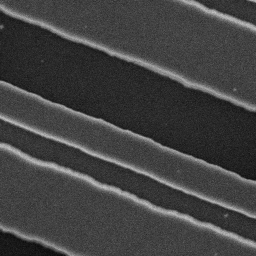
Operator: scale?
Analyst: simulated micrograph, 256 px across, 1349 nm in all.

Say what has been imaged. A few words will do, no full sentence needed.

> lines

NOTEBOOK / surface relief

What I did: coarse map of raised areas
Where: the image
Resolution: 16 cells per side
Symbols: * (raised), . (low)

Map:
****************
..**************
.....***********
.......*********
..........******
*............***
****...........*
******..........
*********.......
***********.....
**************..
****************
****************
****************
.***************
...*************